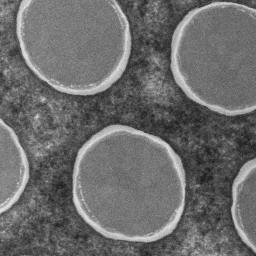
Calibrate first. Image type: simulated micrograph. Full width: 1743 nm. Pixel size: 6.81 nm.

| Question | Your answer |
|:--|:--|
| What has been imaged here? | raised bodies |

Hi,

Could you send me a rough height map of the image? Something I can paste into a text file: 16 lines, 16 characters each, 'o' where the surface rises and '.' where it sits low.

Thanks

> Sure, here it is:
.oooooo......ooo
.ooooooo...ooooo
.ooooooo...ooooo
..oooooo...ooooo
..oooooo...ooooo
....oo......oooo
.............ooo
................
o.....ooo.......
o....oooooo.....
oo...oooooo....o
o....ooooooo...o
o....ooooooo...o
.....oooooo....o
.......ooo.....o
................